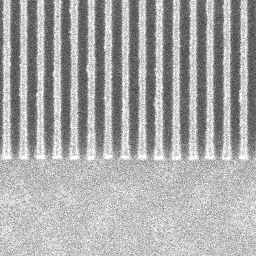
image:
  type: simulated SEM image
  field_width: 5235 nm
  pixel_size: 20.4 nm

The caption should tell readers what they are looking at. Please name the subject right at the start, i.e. parallel lines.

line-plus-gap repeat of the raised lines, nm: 346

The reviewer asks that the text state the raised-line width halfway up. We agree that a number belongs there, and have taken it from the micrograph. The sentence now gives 161 nanometres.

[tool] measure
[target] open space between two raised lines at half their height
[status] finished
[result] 197 nm